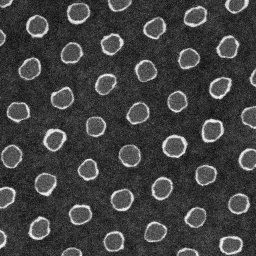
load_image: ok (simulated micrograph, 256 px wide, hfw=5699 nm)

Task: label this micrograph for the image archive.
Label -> a regular array of raised bodies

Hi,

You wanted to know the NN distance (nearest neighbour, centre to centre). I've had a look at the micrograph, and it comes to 941 nm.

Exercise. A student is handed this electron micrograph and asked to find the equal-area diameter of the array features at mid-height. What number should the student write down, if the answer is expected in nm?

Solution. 458